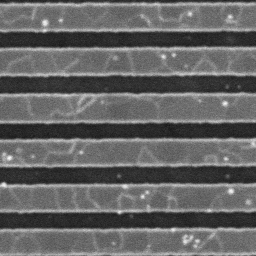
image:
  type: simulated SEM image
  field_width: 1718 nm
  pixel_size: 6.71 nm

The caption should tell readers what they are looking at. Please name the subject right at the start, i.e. lines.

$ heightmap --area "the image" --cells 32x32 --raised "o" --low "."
oooooooooooooooooooooooooooooooo
oooooooooooooooooooooooooooooooo
oooooooooooooooooooooooooooooooo
oooooooooooooooooooooooooooooooo
................................
................................
oooooooooooooooooooooooooooooooo
oooooooooooooooooooooooooooooooo
oooooooooooooooooooooooooooooooo
...ooo..........................
................................
................................
oooooooooooooooooooooooooooooooo
oooooooooooooooooooooooooooooooo
oooooooooooooooooooooooooooooooo
................................
................................
......oo.ooooooooooooooooooooooo
oooooooooooooooooooooooooooooooo
oooooooooooooooooooooooooooooooo
oooooooooooooooooooooooooooooooo
................................
................................
oooooooooooooooooooooooooooooooo
oooooooooooooooooooooooooooooooo
oooooooooooooooooooooooooooooooo
..oo..........oo................
................................
................................
oooooooooooooooooooooooooooooooo
oooooooooooooooooooooooooooooooo
oooooooooooooooooooooooooooooooo